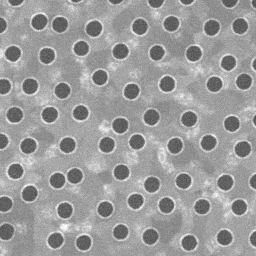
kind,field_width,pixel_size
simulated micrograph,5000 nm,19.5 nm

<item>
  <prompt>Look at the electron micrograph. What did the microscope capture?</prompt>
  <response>a regular array of holes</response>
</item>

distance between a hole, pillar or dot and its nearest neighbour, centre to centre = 551 nm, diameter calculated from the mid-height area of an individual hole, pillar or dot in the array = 323 nanometres